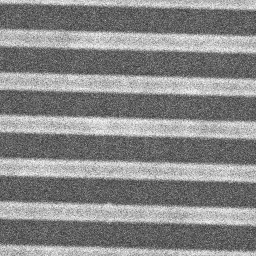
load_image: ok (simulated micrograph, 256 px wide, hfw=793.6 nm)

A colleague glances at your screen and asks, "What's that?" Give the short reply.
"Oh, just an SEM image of parallel lines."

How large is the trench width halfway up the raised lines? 86.4 nanometres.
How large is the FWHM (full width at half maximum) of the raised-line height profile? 47.7 nm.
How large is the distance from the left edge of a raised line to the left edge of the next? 134 nanometers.